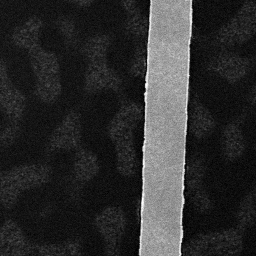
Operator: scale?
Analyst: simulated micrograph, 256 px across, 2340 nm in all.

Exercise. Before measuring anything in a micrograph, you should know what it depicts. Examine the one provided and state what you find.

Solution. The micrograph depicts one or a few lines or trenches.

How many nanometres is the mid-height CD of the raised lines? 382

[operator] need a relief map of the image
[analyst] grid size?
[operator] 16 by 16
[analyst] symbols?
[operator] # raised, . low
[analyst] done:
.........###....
.........###....
.........###....
.........###....
.........###....
.........###....
.........###....
.........###....
.........###....
.........###....
.........###....
.........###....
.........##.....
.........##.....
.........##.....
.........##.....